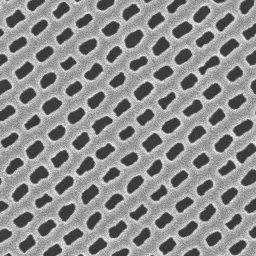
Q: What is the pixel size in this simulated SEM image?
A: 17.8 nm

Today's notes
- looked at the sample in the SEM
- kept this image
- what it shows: a regular array of holes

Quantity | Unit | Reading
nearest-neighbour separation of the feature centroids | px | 25.2